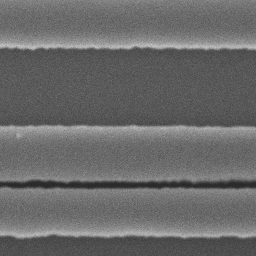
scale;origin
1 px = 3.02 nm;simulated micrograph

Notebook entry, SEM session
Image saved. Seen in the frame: lines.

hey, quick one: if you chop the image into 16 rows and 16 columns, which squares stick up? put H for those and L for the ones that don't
HHHHHHHHHHHHHHHH
HHHHHHHHHHHHHHHH
HHHHHHHHHHHHHHHH
LLLLLLLLLLLLLLLL
LLLLLLLLLLLLLLLL
LLLLLLLLLLLLLLLL
LLLLLLLLLLLLLLLL
LLLLLLLLLLLLLLLL
HHHHHHHHHHHHHHHH
HHHHHHHHHHHHHHHH
HHHHHHHHHHHHHHHH
HHHHHHHHHHHHHHHH
HHHHHHHHHHHHHHHH
HHHHHHHHHHHHHHHH
HHHHHHHHHHHHHHHH
LLLLLLLLLLLLLLLL